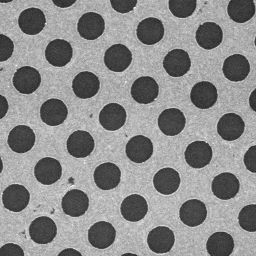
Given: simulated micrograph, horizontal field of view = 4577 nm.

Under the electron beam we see a regular array of holes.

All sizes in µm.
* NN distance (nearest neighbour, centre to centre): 0.744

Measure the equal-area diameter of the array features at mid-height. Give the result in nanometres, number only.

513